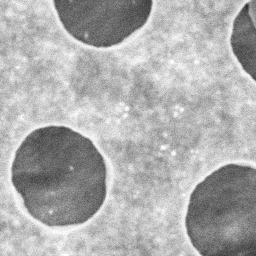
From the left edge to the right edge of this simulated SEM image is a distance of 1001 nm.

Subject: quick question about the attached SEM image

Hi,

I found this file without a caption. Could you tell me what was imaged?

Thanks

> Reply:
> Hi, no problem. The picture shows holes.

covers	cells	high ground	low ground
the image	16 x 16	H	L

HHHLLLLLLHHHHHHL
HHHHLLLLLHHHHHHL
HHHHHLLLHHHHHHLL
HHHHHHHHHHHHHHHL
HHHHHHHHHHHHHHHL
HHHHHHHHHHHHHHHH
HHHHHHHHHHHHHHHH
HHHHHHHHHHHHHHHH
HHLLLHHHHHHHHHHH
HLLLLLHHHHHHHHHH
HLLLLLLHHHHHHHLL
HLLLLLLHHHHHLLLL
HLLLLLLHHHHHLLLL
HHLLLLHHHHHHLLLL
HHHHHHHHHHHHLLLL
HHHHHHHHHHHHLLLL